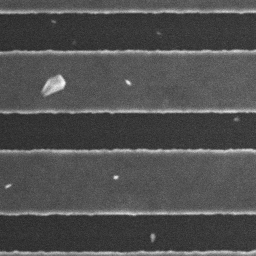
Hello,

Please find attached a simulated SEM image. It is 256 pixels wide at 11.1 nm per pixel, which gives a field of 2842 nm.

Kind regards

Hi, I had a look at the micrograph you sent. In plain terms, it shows lines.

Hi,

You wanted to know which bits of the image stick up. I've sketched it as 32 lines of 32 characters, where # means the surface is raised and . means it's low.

################################
################################
................................
................................
................................
................................
.###############################
################################
################################
################################
################################
################################
################################
################################
................................
................................
................................
................................
................................
################################
################################
################################
################################
################################
################################
################################
################################
................................
................................
................................
................................
.................#.###..#####..#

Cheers